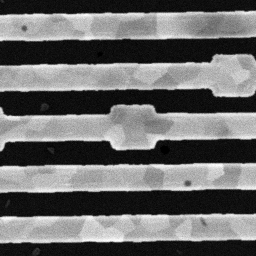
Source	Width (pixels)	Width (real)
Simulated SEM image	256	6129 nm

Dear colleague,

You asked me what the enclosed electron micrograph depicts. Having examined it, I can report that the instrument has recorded wiring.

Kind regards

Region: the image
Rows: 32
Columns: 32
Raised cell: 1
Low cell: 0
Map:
00000000000000000000000000000000
00000000000000000000000000000000
11111111111111111111111111111111
11111111111111111111111111111111
11111111111111111111111111100000
00000000000000000000000000000000
00000000000000000000000000000000
00000000000000000000000000011111
11111111111111111111111111111111
11111111111111111111111111111111
11111111111111111111111111111111
00000000000000000000000000011111
00000000000000000000000000000000
00000000000000111110000000000000
10000000000001111111111111111111
11111111111111111111111111111111
11111111111111111111111111111111
11000000000000111111000000000000
00000000000000000000000000000000
00000000000000000000000000000000
00000000000000000000000000000000
11111111111111111111111111111111
11111111111111111111111111111111
11111111111111111111110100000000
00000000000000000000000000000000
00000000000000000000000000000000
00000000000000000000000000000000
11111111111111111111111111111111
11111111111111111111111111111111
11111111111111111111111111111111
00000000000000000000000000000000
00000000000000000000000000000000